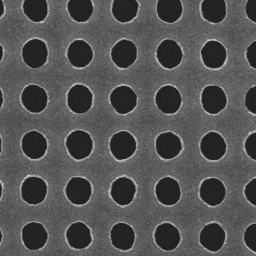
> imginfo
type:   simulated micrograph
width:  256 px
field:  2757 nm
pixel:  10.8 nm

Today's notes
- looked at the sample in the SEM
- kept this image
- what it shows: a regular array of holes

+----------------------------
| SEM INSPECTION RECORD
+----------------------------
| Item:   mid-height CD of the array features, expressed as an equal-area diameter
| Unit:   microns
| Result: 0.288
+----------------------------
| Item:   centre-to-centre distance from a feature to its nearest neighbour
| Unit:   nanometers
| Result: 480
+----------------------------